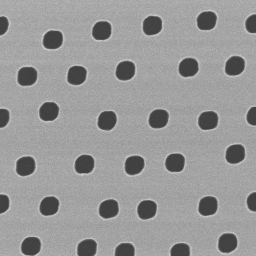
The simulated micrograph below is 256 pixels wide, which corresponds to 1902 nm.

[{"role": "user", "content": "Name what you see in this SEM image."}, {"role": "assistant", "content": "a regular array of holes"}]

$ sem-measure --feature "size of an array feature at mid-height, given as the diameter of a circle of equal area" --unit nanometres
140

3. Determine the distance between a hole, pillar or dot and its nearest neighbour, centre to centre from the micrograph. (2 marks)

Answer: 325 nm